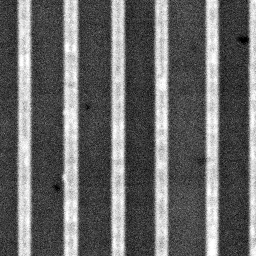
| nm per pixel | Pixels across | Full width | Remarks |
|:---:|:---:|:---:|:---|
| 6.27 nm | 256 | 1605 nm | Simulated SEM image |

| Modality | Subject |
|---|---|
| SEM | parallel lines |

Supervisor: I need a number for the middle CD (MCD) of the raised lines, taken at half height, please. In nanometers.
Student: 68.1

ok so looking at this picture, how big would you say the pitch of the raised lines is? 294 nm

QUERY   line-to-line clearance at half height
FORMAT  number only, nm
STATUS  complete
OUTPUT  222